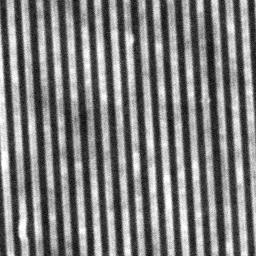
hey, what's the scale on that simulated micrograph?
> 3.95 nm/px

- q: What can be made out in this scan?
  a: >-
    parallel lines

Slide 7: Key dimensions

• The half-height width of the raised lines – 22.2 nm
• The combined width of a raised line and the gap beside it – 57.5 nm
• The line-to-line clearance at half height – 34 nm